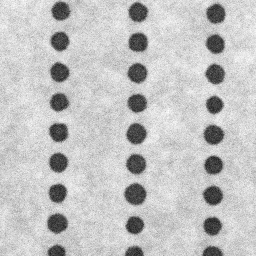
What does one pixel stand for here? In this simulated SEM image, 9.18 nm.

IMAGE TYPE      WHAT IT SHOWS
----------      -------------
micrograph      a regular array of holes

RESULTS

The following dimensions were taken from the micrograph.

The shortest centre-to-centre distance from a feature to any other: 0.277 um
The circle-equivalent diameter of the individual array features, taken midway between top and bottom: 180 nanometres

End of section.